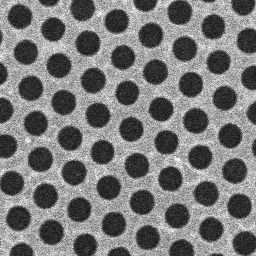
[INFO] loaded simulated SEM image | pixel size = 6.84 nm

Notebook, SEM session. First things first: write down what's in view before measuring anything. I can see a regular array of holes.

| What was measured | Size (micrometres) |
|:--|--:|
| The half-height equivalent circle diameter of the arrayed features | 0.172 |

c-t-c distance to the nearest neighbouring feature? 243 nm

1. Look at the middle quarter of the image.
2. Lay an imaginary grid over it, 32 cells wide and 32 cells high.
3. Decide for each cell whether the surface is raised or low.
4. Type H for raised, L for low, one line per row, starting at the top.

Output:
LLHHHHHHHHHHLLLLLHHHLLLLLLHHHHHH
LLHHHHLLLHHHHHLHHHHHLLLLLLHHHHHH
LHHHHLLLLLHHHHHHHHHHLLLLLLHHHHLL
HHHHLLLLLLHHHHHHHHHHLLLLLLHHHLLL
HHHHLLLLLLLHHHLLLHHHHLLLLHHHHLLL
HHHHLLLLLLHHHLLLLLHHHHHHHHHHHLLL
LHHHHLLLLHHHHLLLLLLHHHHHHHHHHLLL
LLHHHHHHHHHHHLLLLLLHHHHHHHHHHHLL
LLLHHHHHHHHHHLLLLLLHHHHLLHHHHHHH
LLLHHHHHHHHHHHLLLLHHHHLLLLLHHHHH
LLLHHHLLLLLHHHHHHHHHHLLLLLLHHHHH
LLHHHHLLLLLHHHHHHHHHHLLLLLLHHHHL
LHHHHLLLLLLLHHHHHHHHHLLLLLLHHHLL
HHHHHLLLLLLLHHHLLLHHHHLLLLLHHHLL
HHHHHHLLLLLHHHLLLLLHHHHHHHHHHHLL
LLHHHHHLLLHHHHLLLLLLHHHHHHHHHHLL
LLLLHHHHHHHHHHLLLLLLHHHHHLHHHHHL
LLLLLHHHHHHHHHLLLLLLHHHLLLLLHHHH
LLLLLHHHHHHHHHLLLLLHHHHLLLLLLHHH
LLLLHHHHLLLHHHHHLHHHHHLLLLLLLHHH
LLLLHHHLLLLLHHHHHHHHHHHLLLLLHHHH
LLLHHHHLLLLLLHHHHHHHHHHLLLLLHHHH
HHHHHHLLLLLLLHHHHLLLHHHHLLLHHHHL
HHHHHHHLLLLLHHHHLLLLLHHHHHHHHHHL
HLLLHHHHLLLHHHHLLLLLLHHHHHHHHHHL
LLLLLHHHHHHHHHHLLLLLLHHHHHLHHHHH
LLLLLLHHHHHHHHHLLLLLLHHHLLLLLHHH
LLLLLLHHHHHHHHHHLLLLLHHHLLLLLHHH
LLLLLHHHHLLLLHHHHLLHHHHLLLLLLLHH
LLLLLHHHLLLLLLHHHHHHHHHHLLLLLLHH
HHLHHHHHLLLLLLHHHHHHHHHHLLLLLHHH
HHHHHHHHLLLLLLHHHHHLLHHHHLLLHHHH